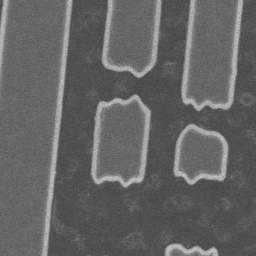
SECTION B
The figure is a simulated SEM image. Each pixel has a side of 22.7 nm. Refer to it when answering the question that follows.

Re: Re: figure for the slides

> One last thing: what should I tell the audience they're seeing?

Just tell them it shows one or a few lines or trenches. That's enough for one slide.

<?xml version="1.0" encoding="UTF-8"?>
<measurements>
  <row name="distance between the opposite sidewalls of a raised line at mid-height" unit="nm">1090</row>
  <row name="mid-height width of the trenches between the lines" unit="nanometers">897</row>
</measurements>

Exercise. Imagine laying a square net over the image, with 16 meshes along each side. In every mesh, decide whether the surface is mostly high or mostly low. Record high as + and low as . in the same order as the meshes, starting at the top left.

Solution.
++++...+++..+++.
++++...+++..+++.
++++...+++..+++.
++++...+++..+++.
++++....+...+++.
++++........+++.
++++...++...++..
++++..+++.......
++++..+++..+++..
+++...+++..+++..
+++...+++..+++..
+++.............
+++.............
+++.............
+++.............
+++.............